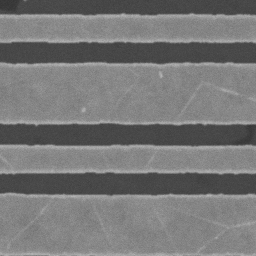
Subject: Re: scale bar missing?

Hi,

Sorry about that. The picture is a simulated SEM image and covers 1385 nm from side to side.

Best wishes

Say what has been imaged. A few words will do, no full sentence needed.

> lines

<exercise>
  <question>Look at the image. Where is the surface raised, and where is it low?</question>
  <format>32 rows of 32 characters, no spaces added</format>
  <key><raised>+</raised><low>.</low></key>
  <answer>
................................
................................
++++++++++++++++++++++++++++++++
++++++++++++++++++++++++++++++++
++++++++++++++++++++++++++++++++
................................
................................
................................
++++++++++++++++++++++++++++++++
++++++++++++++++++++++++++++++++
++++++++++++++++++++++++++++++++
++++++++++++++++++++++++++++++++
++++++++++++++++++++++++++++++++
++++++++++++++++++++++++++++++++
++++++++++++++++++++++++++++++++
................................
................................
................................
++++++++++++++++++++++++++++++++
++++++++++++++++++++++++++++++++
++++++++++++++++++++++++++++++++
+++..................+....++.+++
................................
................................
+++++++++...+...+...++++++++.+++
++++++++++++++++++++++++++++++++
++++++++++++++++++++++++++++++++
++++++++++++++++++++++++++++++++
++++++++++++++++++++++++++++++++
++++++++++++++++++++++++++++++++
++++++++++++++++++++++++++++++++
++++++++++++++++++++++++++++++++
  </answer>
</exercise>